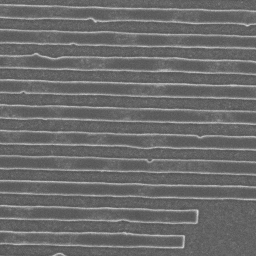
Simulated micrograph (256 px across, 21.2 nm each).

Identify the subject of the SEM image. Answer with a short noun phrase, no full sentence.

parallel lines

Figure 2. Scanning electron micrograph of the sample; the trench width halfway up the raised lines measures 244 nanometers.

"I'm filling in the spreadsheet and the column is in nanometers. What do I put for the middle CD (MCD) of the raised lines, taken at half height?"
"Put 284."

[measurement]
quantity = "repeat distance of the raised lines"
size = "532 nm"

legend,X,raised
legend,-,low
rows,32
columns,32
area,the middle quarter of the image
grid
XXXXXXXXXXXXXXXXXXXXXXXXXXXXXXXX
----XXX---XXXXXXXXXXXXXXXXXXXXXX
--------------------------------
--------------------------------
-XXXX---------------------------
XXXXXXXXXXXXXXXXXXXXXXXXXXXXXXXX
XXXXXXXXXXXXXXXXXXXXXXXXXXXXXXXX
XXXXXXXX--XXXXXXXXXXXXXXXXXXXXXX
--------------------------------
--------------------------------
--------------------------------
XXXXXXXXXXXXXXXXXXXXXXXXXX-XXXXX
XXXXXXXXXXXXXXXXXXXXXXXXXXXXXXXX
XXXXXXXXXXXXXXXXXXXXXXXXXXXXXXXX
---------------------XXXXXXXXXXX
--------------------------------
--------------------------------
XXXXXXXXXXXXXXXXX---------------
XXXXXXXXXXXXXXXXXXXXXXXXXXXXXXXX
XXXXXXXXXXXXXXXXXXXXXXXXXXXXXXXX
------------X-XXXXXXXXXXXXXXXXXX
--------------------------------
--------------------------------
XXXXXXXX------------------------
XXXXXXXXXXXXXXXXXXXXXXXXXXXXXXXX
XXXXXXXXXXXXXXXXXXXXXXXXXXXXXXXX
---XXXXXXXXXXXXXXXXXXXXXXXXXXXXX
--------------------------------
--------------------------------
--------------------------------
XXXXXXXXXXXXXXXXXXXXXXXXXXXXXXXX
XXXXXXXXXXXXXXXXXXXXXXXXXXXXXXXX